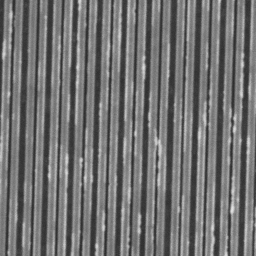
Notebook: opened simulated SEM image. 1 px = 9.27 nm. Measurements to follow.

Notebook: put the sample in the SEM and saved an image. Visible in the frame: parallel lines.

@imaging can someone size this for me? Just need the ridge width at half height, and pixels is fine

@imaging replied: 7.12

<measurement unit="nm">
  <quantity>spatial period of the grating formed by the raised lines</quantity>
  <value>114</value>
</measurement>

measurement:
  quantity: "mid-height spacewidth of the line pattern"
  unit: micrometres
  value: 0.0492